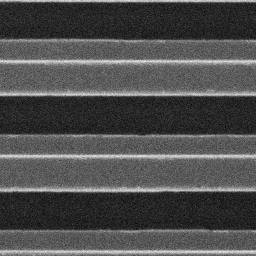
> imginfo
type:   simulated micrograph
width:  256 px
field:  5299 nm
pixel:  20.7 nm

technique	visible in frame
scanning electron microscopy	lines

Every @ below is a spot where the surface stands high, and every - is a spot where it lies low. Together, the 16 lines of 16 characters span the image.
----------------
----------------
----------------
@@@@@@@@@@@@@@@@
@@@@@@@@@@@@@@@@
@@@@@@@@@@@@@@@@
----------------
----------------
@@@@@@@-----@@@-
@@@@@@@@@@@@@@@@
@@@@@@@@@@@@@@@@
@@@@@@@@@@@@@@@@
----------------
----------------
@@@@@@@@@@@@@@@@
@@@@@@@@@@@@@@@@